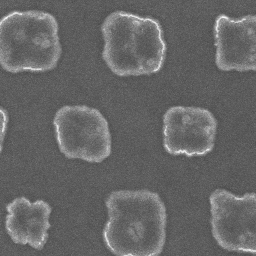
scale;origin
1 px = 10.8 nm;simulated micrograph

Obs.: raised bodies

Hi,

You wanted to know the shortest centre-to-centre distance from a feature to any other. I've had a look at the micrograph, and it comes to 1110 nm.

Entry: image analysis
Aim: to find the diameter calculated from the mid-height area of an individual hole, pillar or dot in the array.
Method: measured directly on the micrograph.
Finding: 569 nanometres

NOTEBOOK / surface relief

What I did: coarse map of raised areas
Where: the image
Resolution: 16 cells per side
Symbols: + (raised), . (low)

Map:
................
+++....+++....++
++++...+++....++
++++...+++....++
.......++.......
................
................
...+++....+++...
....+++...+++...
....+++....++...
................
................
.......+++...+++
.++....+++...+++
.++....+++...+++
.......+++....++